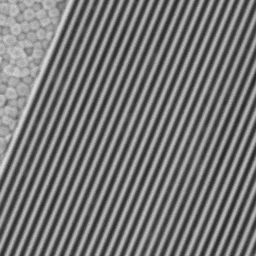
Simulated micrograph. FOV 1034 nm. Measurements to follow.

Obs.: parallel lines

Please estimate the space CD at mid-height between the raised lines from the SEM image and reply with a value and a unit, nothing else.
5.54 px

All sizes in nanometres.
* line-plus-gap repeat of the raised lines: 37.4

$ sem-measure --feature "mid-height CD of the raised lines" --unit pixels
3.81